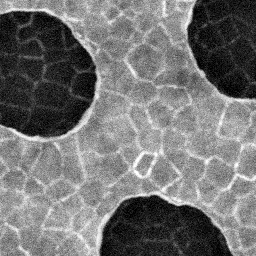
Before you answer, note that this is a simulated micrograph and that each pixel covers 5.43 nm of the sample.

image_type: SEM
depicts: holes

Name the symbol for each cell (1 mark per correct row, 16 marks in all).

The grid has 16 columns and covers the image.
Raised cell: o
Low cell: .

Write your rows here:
oooooooooooo....
....oooooooo....
.....ooooooo....
......oooooo....
......ooooooo...
......ooooooo...
......oooooooooo
.....ooooooooooo
oo..oooooooooooo
oooooooooooooooo
oooooooooooooooo
oooooooooooooooo
oooooooo..oooooo
ooooooo......ooo
oooooo........oo
oooooo........oo